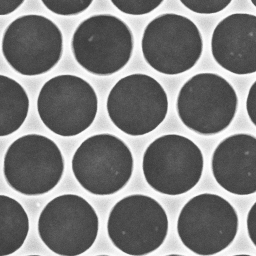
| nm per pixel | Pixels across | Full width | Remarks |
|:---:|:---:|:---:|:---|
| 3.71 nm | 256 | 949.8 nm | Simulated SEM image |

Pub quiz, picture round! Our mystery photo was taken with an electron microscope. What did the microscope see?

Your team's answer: a regular array of holes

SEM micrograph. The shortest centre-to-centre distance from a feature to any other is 0.257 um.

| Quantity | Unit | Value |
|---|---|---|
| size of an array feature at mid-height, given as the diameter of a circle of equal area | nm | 226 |